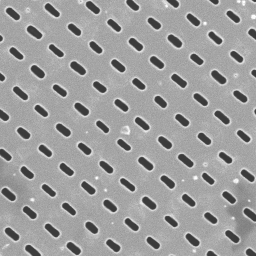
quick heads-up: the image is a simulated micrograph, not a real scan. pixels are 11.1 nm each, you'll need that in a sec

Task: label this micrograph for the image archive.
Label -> a regular array of holes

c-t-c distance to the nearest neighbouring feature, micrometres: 0.307